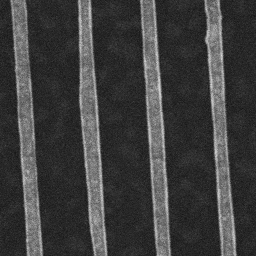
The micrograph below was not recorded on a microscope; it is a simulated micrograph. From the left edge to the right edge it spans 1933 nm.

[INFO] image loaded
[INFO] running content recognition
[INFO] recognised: one or a few lines or trenches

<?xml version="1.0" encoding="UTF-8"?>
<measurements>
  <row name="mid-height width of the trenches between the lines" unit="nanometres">395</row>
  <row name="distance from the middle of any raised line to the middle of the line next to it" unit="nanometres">486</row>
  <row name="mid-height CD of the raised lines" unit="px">12.6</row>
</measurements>